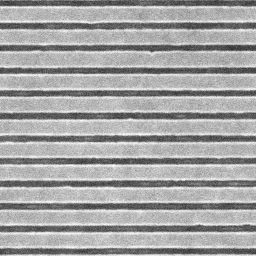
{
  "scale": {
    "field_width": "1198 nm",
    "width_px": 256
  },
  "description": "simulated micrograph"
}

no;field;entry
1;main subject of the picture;parallel lines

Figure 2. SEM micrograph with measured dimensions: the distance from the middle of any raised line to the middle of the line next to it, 106 nanometres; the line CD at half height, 0.069 microns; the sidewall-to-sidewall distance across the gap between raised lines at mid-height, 36.9 nm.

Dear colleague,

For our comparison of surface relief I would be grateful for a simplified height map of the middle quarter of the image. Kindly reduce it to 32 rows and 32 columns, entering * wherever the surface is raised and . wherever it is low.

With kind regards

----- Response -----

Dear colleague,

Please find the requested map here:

********************************
................................
................................
********************************
********************************
********************************
................................
................................
**.....*****.....**.************
********************************
********************************
********************************
................................
................................
********************************
********************************
********************************
********************************
................................
................................
********************************
********************************
********************************
................................
................................
********************************
********************************
********************************
********************************
................................
................................
********************************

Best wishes